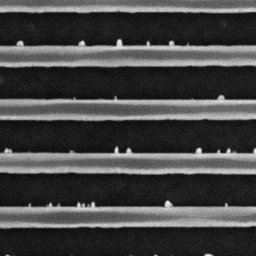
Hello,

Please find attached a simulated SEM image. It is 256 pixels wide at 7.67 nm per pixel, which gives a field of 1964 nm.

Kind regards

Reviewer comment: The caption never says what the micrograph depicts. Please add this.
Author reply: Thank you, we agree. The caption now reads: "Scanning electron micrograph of lines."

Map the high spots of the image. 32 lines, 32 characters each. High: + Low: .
++++++++++++++++++++++++++++++++
................................
................................
................................
................................
................................
++++++++++++++++++++++++++++++++
++++++++++++++++++++++++++++++++
................................
................................
................................
................................
................................
++++++++++++++++++++++++++++++++
++++++++++++++++++++++++++++++++
................................
................................
................................
................................
++++++++++++++++++++++++++++++++
++++++++++++++++++++++++++++++++
....+..........+++++++++++++++++
................................
................................
................................
................................
++++++++++++++++++++++++++++++++
++++++++++++++++++++++++++++++++
................................
................................
................................
................................